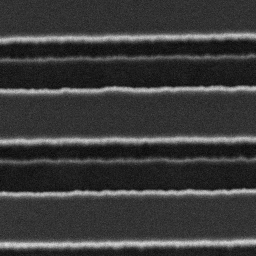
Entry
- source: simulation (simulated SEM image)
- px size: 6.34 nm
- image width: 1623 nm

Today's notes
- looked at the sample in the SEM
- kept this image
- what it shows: lines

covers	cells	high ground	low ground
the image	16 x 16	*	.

****************
****************
***.............
................
................
.......*...*****
****************
****************
****************
................
................
................
****************
****************
****************
................